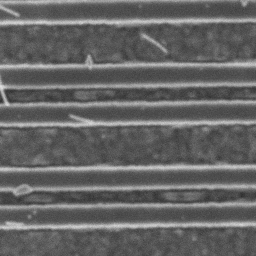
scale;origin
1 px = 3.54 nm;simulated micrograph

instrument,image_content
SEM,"lines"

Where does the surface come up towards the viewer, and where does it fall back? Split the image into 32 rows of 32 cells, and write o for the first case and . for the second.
oooooooooooooooooooooooooooooooo
oooooooooooooooooooooooooooooooo
oooooooooooooooooooooooooooooooo
................................
................................
................................
................................
................................
oooooooooooooooooooooooooooooooo
oooooooooooooooooooooooooooooooo
oooooooooooooooooooooooooooooooo
................................
................................
oooooooooooooooooooooooooooooooo
oooooooooooooooooooooooooooooooo
oooooooooooooooooooooo..o.......
................................
................................
................................
................................
................................
oooooooooooooooooooooooooooooooo
oooooooooooooooooooooooooooooooo
ooooooooooooooooooooooooo.o.o...
................................
..........................o.oooo
oooooooooooooooooooooooooooooooo
oooooooooooooooooooooooooooooooo
...o............................
................................
................................
................................